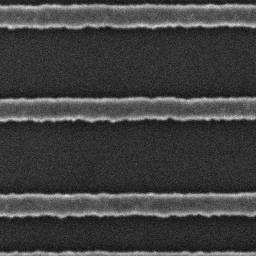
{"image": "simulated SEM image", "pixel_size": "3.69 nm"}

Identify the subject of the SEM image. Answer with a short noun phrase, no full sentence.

lines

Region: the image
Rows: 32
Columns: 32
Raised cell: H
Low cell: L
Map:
LLLLLLLLLLLLLLLLLLLLLLLLLLLLLLLL
HHHHHHHHHHHHHHHHHHHHHHHHHHHHHHHH
HHHHHHHHHHHHHHHHHHHHHHHHHHHHHHHH
LLLLLLLLLHLLLLLLLLLLLLLLLLLLLLLL
LLLLLLLLLLLLLLLLLLLLLLLLLLLLLLLL
LLLLLLLLLLLLLLLLLLLLLLLLLLLLLLLL
LLLLLLLLLLLLLLLLLLLLLLLLLLLLLLLL
LLLLLLLLLLLLLLLLLLLLLLLLLLLLLLLL
LLLLLLLLLLLLLLLLLLLLLLLLLLLLLLLL
LLLLLLLLLLLLLLLLLLLLLLLLLLLLLLLL
LLLLLLLLLLLLLLLLLLLLLLLLLLLLLLLL
LLLLLLLLLLLLLLLLLLLLLLLLLLLLLLLL
HHHHHHHHHHHHHHHHHHHHHHHHHHHHHHHH
HHHHHHHHHHHHHHHHHHHHHHHHHHHHHHHH
HHHHHHHHHHHHHHHHHHHHHHHHHHHHHHHH
LLLLLLLLLLLLLLLLLLLLLLLLLLLLLLLL
LLLLLLLLLLLLLLLLLLLLLLLLLLLLLLLL
LLLLLLLLLLLLLLLLLLLLLLLLLLLLLLLL
LLLLLLLLLLLLLLLLLLLLLLLLLLLLLLLL
LLLLLLLLLLLLLLLLLLLLLLLLLLLLLLLL
LLLLLLLLLLLLLLLLLLLLLLLLLLLLLLLL
LLLLLLLLLLLLLLLLLLLLLLLLLLLLLLLL
LLLLLLLLLLLLLLLLLLLLLLLLLLLLLLLL
LLLLLLLLLLLLLLLLLLLLLLLLLLLLLLLL
HHHHHHHHHHHHHHHHHHHHHHHHHHHHHHHH
HHHHHHHHHHHHHHHHHHHHHHHHHHHHHHHH
HHHHHHHHHHHHHHHHHHHHHHHHHHHHHHHH
LLLLLLLLLLLLLLLLLLLLLLLLLLLLLLLL
LLLLLLLLLLLLLLLLLLLLLLLLLLLLLLLL
LLLLLLLLLLLLLLLLLLLLLLLLLLLLLLLL
LLLLLLLLLLLLLLLLLLLLLLLLLLLLLLLL
LLLLLLLLLLLLHLLLLLLLLLLLLLLLLLLL